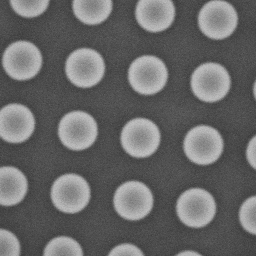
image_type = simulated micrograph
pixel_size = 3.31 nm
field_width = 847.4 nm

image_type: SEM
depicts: an array of small figures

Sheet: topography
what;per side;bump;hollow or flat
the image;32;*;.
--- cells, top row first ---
.*****...*****...*****....***...
..***....*****...*****...****...
..........***....*****...*****..
..................***....****...
..........................**....
..**............................
.****....***....................
*****...*****....***............
.****...*****...*****....***....
.***....*****...*****...*****...
.........***....*****...*****...
.................***....****....
.........................**.....
***.............................
****....***.....................
****...*****....***.............
****...*****...*****....***.....
.**.....****...*****...*****...*
.........**....*****...*****...*
.................*.....****....*
.........................*.....*
***.............................
***....****.....................
***...*****....***..............
***...*****...*****....***......
**.....****...*****...*****...**
........**.....****...*****...**
.......................***....**
...............................*
**..............................
**....****......................
**....****....****.....*........